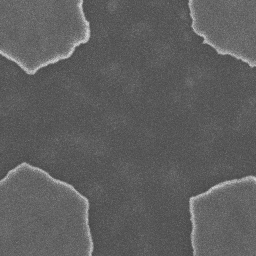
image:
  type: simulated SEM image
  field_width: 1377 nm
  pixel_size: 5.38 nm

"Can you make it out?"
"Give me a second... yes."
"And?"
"raised bodies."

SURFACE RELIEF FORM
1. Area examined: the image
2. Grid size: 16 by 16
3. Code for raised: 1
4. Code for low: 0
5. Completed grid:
1111100000001111
1111110000001111
1111100000000111
1111000000000001
0000000000000000
0000000000000000
0000000000000000
0000000000000000
0000000000000000
0000000000000000
0100000000000000
1111000000000011
1111100000001111
1111110000001111
1111110000001111
1111110000001111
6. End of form